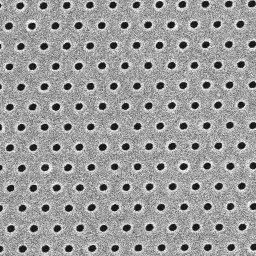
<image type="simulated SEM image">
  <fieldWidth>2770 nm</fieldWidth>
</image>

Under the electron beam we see a regular array of holes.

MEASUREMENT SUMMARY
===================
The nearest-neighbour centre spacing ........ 248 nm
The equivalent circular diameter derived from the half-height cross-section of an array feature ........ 82.8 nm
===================